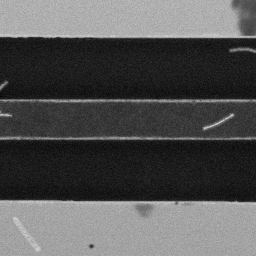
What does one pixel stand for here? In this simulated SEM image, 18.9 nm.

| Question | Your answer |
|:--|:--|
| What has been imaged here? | lines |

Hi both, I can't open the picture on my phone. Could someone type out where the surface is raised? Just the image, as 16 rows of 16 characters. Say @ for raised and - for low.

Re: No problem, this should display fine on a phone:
@@@@@@@@@@@@@@@@
@@@@@@@@@@@@@@@@
----------------
----------------
----------------
----------------
@@@@@@@@@@@@@@@@
@@@@@@@@@@@@@@@@
@@@@@@@@@@@@@@@@
----------------
----------------
----------------
----------------
@@@@@@@@@@@@@@@@
@@@@@@@@@@@@@@@@
@@@@@@@@@@@@@@@@